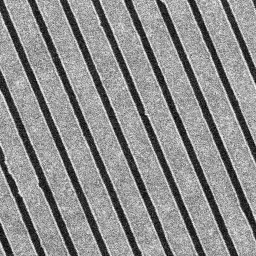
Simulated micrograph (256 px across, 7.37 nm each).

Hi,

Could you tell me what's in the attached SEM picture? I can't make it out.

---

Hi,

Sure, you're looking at parallel lines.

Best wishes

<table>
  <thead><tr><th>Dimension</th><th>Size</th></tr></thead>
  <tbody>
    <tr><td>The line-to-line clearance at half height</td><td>0.0603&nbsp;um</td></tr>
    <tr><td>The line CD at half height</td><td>155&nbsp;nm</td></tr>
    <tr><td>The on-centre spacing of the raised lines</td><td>218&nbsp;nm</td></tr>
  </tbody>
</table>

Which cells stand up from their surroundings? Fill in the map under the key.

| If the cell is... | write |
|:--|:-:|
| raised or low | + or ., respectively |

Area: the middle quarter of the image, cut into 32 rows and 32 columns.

+++++...++++++..++++++..++++++..
++++++..++++++..++++++..++++++..
.+++++...+++++...+++++...+++++..
.++++++..++++++..++++++..++++++.
..+++++...+++++...+++++...+++++.
..++++++..++++++..++++++..++++++
..++++++...+++++..++++++..++++++
+..+++++...++++++..+++++...+++++
+..++++++..++++++..++++++..+++++
+...+++++...+++++...+++++...++++
++..++++++..++++++..++++++..++++
++..++++++...+++++..++++++..++++
+++..+++++...++++++..++++++..+++
+++..++++++..++++++..++++++..+++
+++...+++++...+++++...+++++...++
++++..++++++..++++++..++++++..++
++++...+++++...+++++...+++++..++
+++++..++++++..++++++..++++++..+
+++++..++++++...+++++..++++++..+
++++++..+++++...++++++..+++++...
++++++..++++++..++++++..++++++..
.+++++...+++++...+++++...+++++..
.++++++..++++++..++++++..++++++.
..+++++..++++++...+++++...+++++.
..++++++..+++++...++++++..++++++
..++++++..++++++..++++++..++++++
...+++++...+++++...+++++...+++++
+..++++++..++++++..++++++..+++++
+...+++++...+++++..++++++...++++
++..++++++..++++++..++++++..++++
++..++++++..++++++...+++++..++++
++...++++++..+++++...++++++..+++